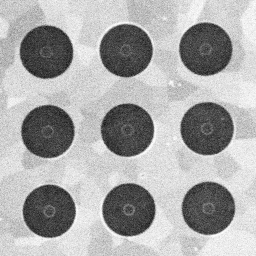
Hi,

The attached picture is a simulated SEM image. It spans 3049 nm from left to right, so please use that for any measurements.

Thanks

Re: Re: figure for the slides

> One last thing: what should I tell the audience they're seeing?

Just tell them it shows an array of small figures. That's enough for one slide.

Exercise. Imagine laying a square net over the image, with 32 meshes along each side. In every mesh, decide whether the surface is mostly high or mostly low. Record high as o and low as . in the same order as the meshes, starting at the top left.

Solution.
oooooooooooooooooooooooooooooooo
oooooooooooooooooooooooooooooooo
oooooooooooooooooooooooooooooooo
oooo...ooooooo....oooooo....oooo
ooo......oooo......oooo......ooo
ooo......ooo.......ooo.......ooo
oo.......ooo.......ooo.......ooo
ooo......oooo......oooo......ooo
ooo......oooo.....ooooo.....oooo
oooo...oooooooo..oooooooo.oooooo
oooooooooooooooooooooooooooooooo
oooooooooooooooooooooooooooooooo
oooooooooooooooooooooooooooooooo
oooo....oooooo....oooooo....oooo
ooo......oooo......oooo......ooo
ooo......oooo......oooo......ooo
ooo......oooo......ooo.......ooo
ooo......oooo......oooo......ooo
ooo......oooo......oooo.....oooo
ooooo...ooooooo..ooooooooooooooo
oooooooooooooooooooooooooooooooo
oooooooooooooooooooooooooooooooo
oooooooooooooooooooooooooooooooo
oooo....oooooo....oooooo....oooo
ooo......oooo......oooo......ooo
ooo......oooo......oooo......ooo
ooo.......ooo......oooo......ooo
ooo......oooo......oooo......ooo
ooo......oooo......ooooo....oooo
ooooo..oooooooo..ooooooooooooooo
oooooooooooooooooooooooooooooooo
oooooooooooooooooooooooooooooooo